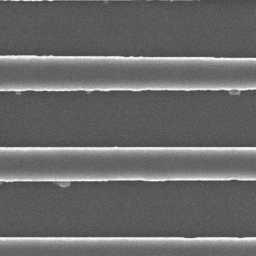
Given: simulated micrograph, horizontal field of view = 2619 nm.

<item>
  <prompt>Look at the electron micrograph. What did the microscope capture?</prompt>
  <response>lines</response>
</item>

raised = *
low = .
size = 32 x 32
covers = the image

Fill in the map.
................................
................................
................................
................................
................................
................................
................................
********************************
********************************
********************************
********************************
................................
................................
................................
................................
................................
................................
................................
********************************
********************************
********************************
********************************
**************....***...........
................................
................................
................................
................................
................................
................................
................................
********************************
********************************